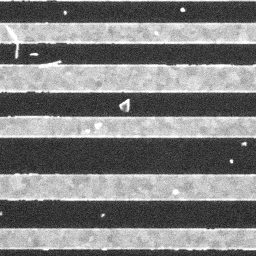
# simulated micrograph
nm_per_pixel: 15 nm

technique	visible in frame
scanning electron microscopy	lines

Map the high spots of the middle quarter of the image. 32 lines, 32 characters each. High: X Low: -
XXXXXXXXXXXXXXXXXXXXXXXXXX--XX-X
XXXXXXXXXXXXXXXXXXXXXXXXXXXXXXXX
XXXXXXXXXXXXXXXXXXXXXXXXXXXXXXXX
XXXXXXXXXXXXXXXXXXXXXXXXXXXXXXXX
XXXXXXXXXXXXXXXXXXXXXXXXXXXXXXXX
XXXXXXXXXXXXXXXXXXXXXXXXXXXXXXXX
XXXXXXXXXXXXXXXXXXXXXXXXXXXXXXXX
--------------------------------
--------------------------------
---------------X----------------
--------------XX----------------
--------------------------------
--------------------------------
XXXXXXXXXXXXXXXXXXXXXXXXXXXXXXXX
XXXXXXXXXXXXXXXXXXXXXXXXXXXXXXXX
XXXXXXXXXXXXXXXXXXXXXXXXXXXXXXXX
XXXXXXXXXXXXXXXXXXXXXXXXXXXXXXXX
XXXXXXXXXXXXXXXXXXXXXXXXXXXXXXXX
--------------------------------
--------------------------------
--------------------------------
--------------------------------
--------------------------------
--------------------------------
--------------------------------
--------------------------------
--------------------------------
--------------------------------
XXXXXXXXXXXXXXXXXXXXXXXXXXXXXXXX
XXXXXXXXXXXXXXXXXXXXXXXXXXXXXXXX
XXXXXXXXXXXXXXXXXXXXXXXXXXXXXXXX
XXXXXXXXXXXXXXXXXXXXXXXXXXXXXXXX